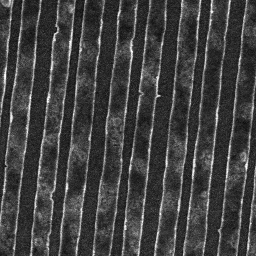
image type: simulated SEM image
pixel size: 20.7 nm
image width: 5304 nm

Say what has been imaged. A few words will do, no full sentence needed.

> parallel lines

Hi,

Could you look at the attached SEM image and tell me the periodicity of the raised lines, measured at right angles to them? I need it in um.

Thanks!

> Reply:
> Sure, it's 0.651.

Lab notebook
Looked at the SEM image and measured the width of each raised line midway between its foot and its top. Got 0.384 um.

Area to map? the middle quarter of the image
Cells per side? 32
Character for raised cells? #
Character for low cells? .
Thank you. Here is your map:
#...####....#####...####....####
#..#####....#####...####....####
#..#####....####...#####....####
#..#####....####...#####....####
#..#####....####...####.....####
#..#####....####...####.....####
...#####....####...####.....####
...#####....####...####.....####
...#####...#####...####....#####
...####....#####...####....#####
...####....#####...####....####.
...####....####...#####....####.
..#####....####...####.....####.
..#####....####...####.....####.
..#####....####...####.....####.
..#####....####...####....#####.
..#####...#####...####....#####.
..#####....####...####....#####.
..####....#####...####....#####.
..#####...#####..#####....#####.
..####....#####..#####....####..
...###....#####..####.....#####.
.#####....####...####.....####..
.#####....####...####.....####..
.#####....####...####.....####..
.#####....####...####.....####..
.#####....####..#####....#####..
.#####....####..#####....#####..
.#####...#####..#####....#####..
.####....#####..#####....####...
.####....#####..####.....####...
.####....####...####.....####...